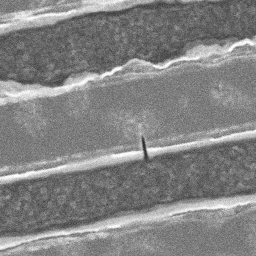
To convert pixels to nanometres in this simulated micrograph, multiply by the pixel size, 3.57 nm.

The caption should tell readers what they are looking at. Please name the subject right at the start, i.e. one or a few lines or trenches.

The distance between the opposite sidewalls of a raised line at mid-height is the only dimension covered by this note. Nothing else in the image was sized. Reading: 319 nanometers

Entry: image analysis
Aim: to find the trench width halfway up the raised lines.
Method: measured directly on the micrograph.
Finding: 219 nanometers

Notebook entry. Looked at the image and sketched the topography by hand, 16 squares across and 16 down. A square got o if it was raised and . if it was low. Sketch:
ooooooo.........
o...............
................
............oooo
.......ooooooooo
oo.ooooooooooooo
oooooooooooooooo
oooooooooooooooo
ooooooooooooooo.
oooooooooo......
oooo............
................
..............oo
.........ooooooo
....oooooooooooo
oooooooooooooooo